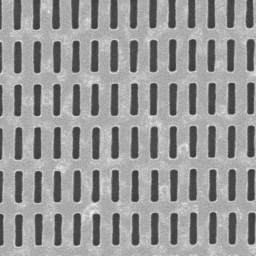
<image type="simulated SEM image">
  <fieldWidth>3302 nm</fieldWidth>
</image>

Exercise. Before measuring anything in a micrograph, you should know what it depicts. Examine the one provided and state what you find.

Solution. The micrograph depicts a regular array of holes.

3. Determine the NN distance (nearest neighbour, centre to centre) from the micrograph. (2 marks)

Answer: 0.248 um